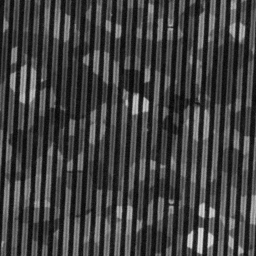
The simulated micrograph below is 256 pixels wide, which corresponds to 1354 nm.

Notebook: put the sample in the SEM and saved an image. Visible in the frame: parallel lines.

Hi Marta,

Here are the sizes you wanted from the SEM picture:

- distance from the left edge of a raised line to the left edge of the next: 0.0544 µm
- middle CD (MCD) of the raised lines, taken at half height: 20.5 nanometres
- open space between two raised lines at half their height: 30.4 nm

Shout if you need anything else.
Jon